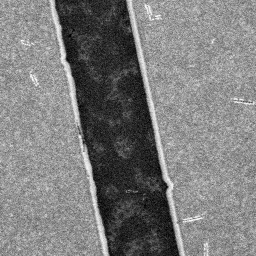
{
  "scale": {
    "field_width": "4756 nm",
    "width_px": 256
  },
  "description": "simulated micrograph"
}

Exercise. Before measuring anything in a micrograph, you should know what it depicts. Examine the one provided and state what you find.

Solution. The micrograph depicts one or a few lines or trenches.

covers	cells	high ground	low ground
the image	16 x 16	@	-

@@@-----@@@@@@@@
@@@@----@@@@@@@@
@@@@-----@@@@@@@
@@@@-----@@@@@@@
@@@@-----@@@@@@@
@@@@@----@@@@@@@
@@@@@----@@@@@@@
@@@@@-----@@@@@@
@@@@@-----@@@@@@
@@@@@-----@@@@@@
@@@@@@----@@@@@@
@@@@@@----@@@@@@
@@@@@@-----@@@@@
@@@@@@-----@@@@@
@@@@@@-----@@@@@
@@@@@@@----@@@@@